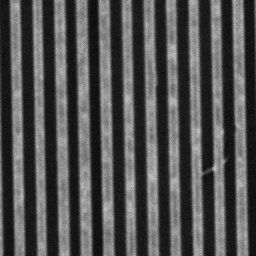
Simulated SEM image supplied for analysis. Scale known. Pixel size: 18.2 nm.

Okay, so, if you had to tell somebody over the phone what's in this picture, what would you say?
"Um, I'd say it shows parallel lines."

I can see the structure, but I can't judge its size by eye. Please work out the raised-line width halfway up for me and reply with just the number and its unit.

0.17 µm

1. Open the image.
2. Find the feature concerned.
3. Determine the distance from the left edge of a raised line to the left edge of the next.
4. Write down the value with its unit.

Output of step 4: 0.405 microns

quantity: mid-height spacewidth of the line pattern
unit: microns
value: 0.238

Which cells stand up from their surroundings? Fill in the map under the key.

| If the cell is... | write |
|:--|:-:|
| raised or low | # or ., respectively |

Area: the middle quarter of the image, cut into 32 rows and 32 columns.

...###...##....##....##...##....
...###...##....##...###...##....
....##...##....##....##...##....
....##...###...##....##...##....
#...##...###...##....##...##....
#...##...###...##...###...##....
#...##...###...##...###...##....
#...##...###...##....##...##....
#...##...###...##....##...##....
#...##...###...##....##...##....
#...##...###...##....##...##....
#...##...###...##....##...##....
#...##...###...##....##...##....
#...##...###...##....##...##....
#...##...###...##....##...##....
#...##...###...##....##...##....
#...##...###...##....##...##....
#...##...###...##....##...##....
#...##...###...##....##...##....
#...##...###...##....##...##....
#...##...###...##....##...##....
#...##....##...##....##...##....
#...##....##...##....##...###...
#...##....##...##....##...###...
#...###...##...##....##...###...
#...###...##...##....##...###...
#...###...##...##....##....##...
#...###...##...##....##....##...
#...###...##....#....##....##...
#...###...##....#....##....##...
#...###...##....#....##....##...
#...###...##....#....##....##...